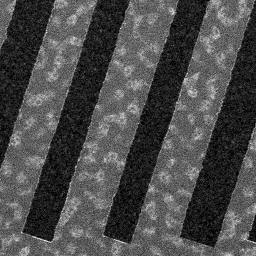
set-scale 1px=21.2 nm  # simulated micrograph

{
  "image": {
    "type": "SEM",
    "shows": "one or a few lines or trenches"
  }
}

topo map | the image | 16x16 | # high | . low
.##...##...##...
.##...##...##..#
###..##...##...#
##...##...##...#
##...##...##..##
##..##...##...##
#...##...##...##
#...##...##..###
#..##...##...###
...##...##...##.
...##...##...##.
..##...##...###.
..##...##...##..
..##...##...##..
..#....#...###..
................